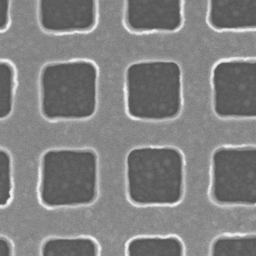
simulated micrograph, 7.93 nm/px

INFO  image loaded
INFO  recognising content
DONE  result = holes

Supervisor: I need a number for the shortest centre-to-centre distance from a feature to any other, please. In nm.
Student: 675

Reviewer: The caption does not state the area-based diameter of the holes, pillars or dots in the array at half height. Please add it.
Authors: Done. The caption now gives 476 nanometers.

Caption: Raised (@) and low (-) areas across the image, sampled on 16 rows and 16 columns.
@@@---@@---@@---
@@@---@@---@@---
@@@@@@@@@@@@@@@@
@@@@@@@@@@@@@@@@
-@@---@@---@@---
-@@---@@---@@---
-@@---@@---@@---
@@@@@@@@@@@@@@@@
@@@@@@@@@@@@@@@@
@@@---@@---@@@--
-@@---@@---@@---
-@@---@@---@@---
@@@---@@@--@@@--
@@@@@@@@@@@@@@@@
@@@@@@@@@@@@@@@@
-@@---@@---@@---